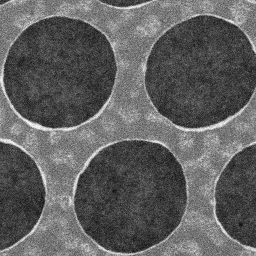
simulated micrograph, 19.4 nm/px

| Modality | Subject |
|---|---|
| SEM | holes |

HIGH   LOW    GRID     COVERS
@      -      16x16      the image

@@@@@@@@@@@@@@@@
@@----@@@@@----@
@------@@@------
-------@@-------
-------@@-------
-------@@-------
@------@@@-----@
@@----@@@@@---@@
@@@@@@@@@@@@@@@@
--@@@@-----@@@@-
--@@@------@@@--
---@@-------@@--
---@@-------@---
---@@------@@@--
--@@@------@@@--
-@@@@@---@@@@@@@